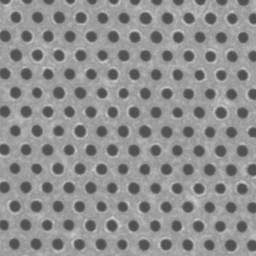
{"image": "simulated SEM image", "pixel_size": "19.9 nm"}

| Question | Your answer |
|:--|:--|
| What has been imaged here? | a regular array of holes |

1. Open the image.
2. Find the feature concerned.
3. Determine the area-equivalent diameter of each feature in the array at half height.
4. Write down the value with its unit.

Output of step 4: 230 nm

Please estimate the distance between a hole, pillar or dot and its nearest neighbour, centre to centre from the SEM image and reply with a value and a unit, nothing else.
0.425 µm